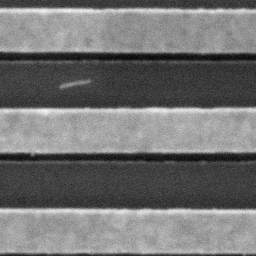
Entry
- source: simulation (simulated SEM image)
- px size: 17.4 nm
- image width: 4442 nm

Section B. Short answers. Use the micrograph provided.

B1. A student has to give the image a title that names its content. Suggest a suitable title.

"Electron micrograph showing lines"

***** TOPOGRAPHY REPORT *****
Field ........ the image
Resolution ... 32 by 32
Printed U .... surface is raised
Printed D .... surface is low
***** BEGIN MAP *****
DDDDDDDDDDDDDDDDDDDDDDDDDDDDDDDD
UUUUUUUUUUUUUUUUUUUUUUUUUUUUUUUU
UUUUUUUUUUUUUUUUUUUUUUUUUUUUUUUU
UUUUUUUUUUUUUUUUUUUUUUUUUUUUUUUU
UUUUUUUUUUUUUUUUUUUUUUUUUUUUUUUU
UUUUUUUUUUUUUUUUUUUUUUUUUUUUUUUU
DDDDDDDDDDDDDDDDDDDDDDDDDDDDDDDU
DDDDDDDDDDDDDDDDDDDDDDDDDDDDDDDD
DDDDDDDDDDDDDDDDDDDDDDDDDDDDDDDD
DDDDDDDDDDDDDDDDDDDDDDDDDDDDDDDD
DDDDDDDDDDDDDDDDDDDDDDDDDDDDDDDD
DDDDDDDDDDDDDDDDDDDDDDDDDDDDDDDD
DDDDDDDDDDDDDDDDDDDDDDDDDDDDDDDD
DDDDDDDDDDDDDDDDDDDDDDDDDDDDDDDD
UUUUUUUUUUUUUUUUUUUUUUUUUUUUUUUU
UUUUUUUUUUUUUUUUUUUUUUUUUUUUUUUU
UUUUUUUUUUUUUUUUUUUUUUUUUUUUUUUU
UUUUUUUUUUUUUUUUUUUUUUUUUUUUUUUU
UUUUUUUUUUUUUUUUUUUUUUUUUUUUUUUU
DDDDDDDDDDDDDDDDDDDDDDDDDDDDDDDD
DDDDDDDDDDDDDDDDDDDDDDDDDDDDDDDD
DDDDDDDDDDDDDDDDDDDDDDDDDDDDDDDD
DDDDDDDDDDDDDDDDDDDDDDDDDDDDDDDD
DDDDDDDDDDDDDDDDDDDDDDDDDDDDDDDD
DDDDDDDDDDDDDDDDDDDDDDDDDDDDDDDD
DDDDDDDDDDDDDDDDDDDDDDDDDDDDDDDD
UUUUUUUUUUUUUUUUUUUUUUUUUUUUUUUU
UUUUUUUUUUUUUUUUUUUUUUUUUUUUUUUU
UUUUUUUUUUUUUUUUUUUUUUUUUUUUUUUU
UUUUUUUUUUUUUUUUUUUUUUUUUUUUUUUU
UUUUUUUUUUUUUUUUUUUUUUUUUUUUUUUU
DDDDDDDDDDDDDDDDDUUUDDDDUUUUUUUU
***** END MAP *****